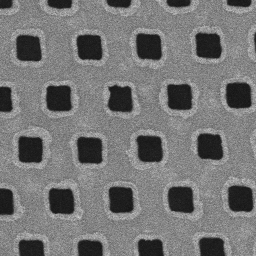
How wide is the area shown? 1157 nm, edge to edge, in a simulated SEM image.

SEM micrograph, a regular array of holes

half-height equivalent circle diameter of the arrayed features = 0.121 micrometres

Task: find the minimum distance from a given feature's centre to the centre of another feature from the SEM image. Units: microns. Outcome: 0.264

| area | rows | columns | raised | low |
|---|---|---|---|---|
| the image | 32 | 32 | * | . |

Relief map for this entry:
.*****...*****..*****...*****..*
********************************
********************************
********************************
**..******..*****...*****..*****
**...*****...****...****....****
**...*****...****...*****...****
***..***************************
********************************
********************************
*****************************..*
.*****...*****..*****...****...*
.*****...*****..*****...****...*
.*****...*****..*****...******.*
********************************
********************************
********************************
**...*****..*****...*****...****
**...*****...****...*****...****
**...*****...****...*****...****
********************************
********************************
********************************
**************..*****...*****..*
..****...*****...****...****....
..****...*****...****...*****...
..*****..*****..*******.********
********************************
********************************
********************************
**...*****...****...*****...****
**...*****...****...*****...****